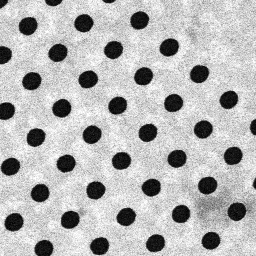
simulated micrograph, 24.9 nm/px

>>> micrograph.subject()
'a regular array of holes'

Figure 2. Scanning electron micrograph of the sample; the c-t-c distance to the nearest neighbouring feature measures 967 nanometers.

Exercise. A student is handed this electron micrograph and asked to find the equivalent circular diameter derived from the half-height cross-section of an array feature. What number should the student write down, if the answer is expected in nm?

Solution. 466